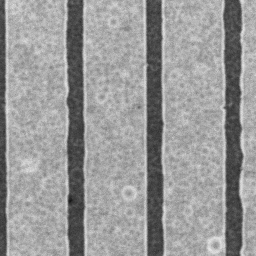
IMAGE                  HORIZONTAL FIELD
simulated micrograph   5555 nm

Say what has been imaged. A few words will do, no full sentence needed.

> one or a few lines or trenches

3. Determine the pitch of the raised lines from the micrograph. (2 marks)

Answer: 1700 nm